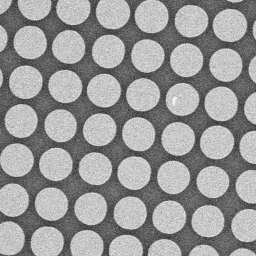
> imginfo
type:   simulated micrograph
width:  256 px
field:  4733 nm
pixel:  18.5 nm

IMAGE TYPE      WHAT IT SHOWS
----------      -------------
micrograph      an array of small figures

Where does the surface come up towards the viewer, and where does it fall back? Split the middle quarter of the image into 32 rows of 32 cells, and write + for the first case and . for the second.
.........++++.....++++++...+++++
...................++++....+++++
+++.........................++++
++++...++++++...................
++++..++++++++...+++++..........
++++..++++++++..+++++++....+++++
++++..++++++++..++++++++..++++++
++++..++++++++..++++++++..++++++
+++...++++++++..++++++++..++++++
++.....++++++...+++++++...++++++
.........+++.....++++++...++++++
..................+++.....++++++
++......+...................+++.
++....++++++......+.............
+++..++++++++...+++++...........
+++..++++++++..+++++++....+++++.
+++..++++++++..++++++++..+++++++
+++..++++++++..++++++++..+++++++
++...+++++++...++++++++..+++++++
......+++++....+++++++...+++++++
................++++++...+++++++
.................+++.....+++++++
+.....+++..................+++..
++...++++++.....+++.............
++..++++++++..+++++++.....+++...
++..++++++++..+++++++...++++++..
++..++++++++..++++++++..+++++++.
+...++++++++.+++++++++.++++++++.
.....++++++...+++++++..++++++++.
......++++....+++++++...+++++++.
...............+++++....+++++++.
.........................+++++..